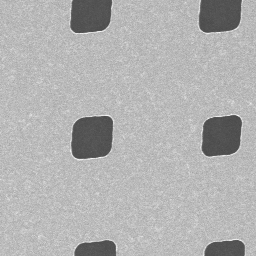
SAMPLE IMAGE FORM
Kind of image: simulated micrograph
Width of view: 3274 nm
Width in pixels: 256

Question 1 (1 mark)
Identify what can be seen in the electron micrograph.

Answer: holes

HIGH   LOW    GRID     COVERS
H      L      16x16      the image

HHHHLLLHHHHHHLLH
HHHHLLLHHHHHLLLH
HHHHHHHHHHHHHHHH
HHHHHHHHHHHHHHHH
HHHHHHHHHHHHHHHH
HHHHHHHHHHHHHHHH
HHHHHHHHHHHHHHHH
HHHHHLLHHHHHHLLH
HHHHHLLHHHHHHLLH
HHHHHLLHHHHHHLLH
HHHHHHHHHHHHHHHH
HHHHHHHHHHHHHHHH
HHHHHHHHHHHHHHHH
HHHHHHHHHHHHHHHH
HHHHHHHHHHHHHHHH
HHHHHLLHHHHHHLLH